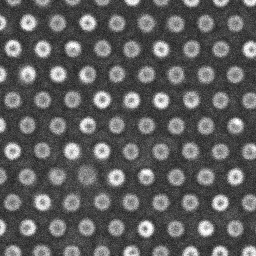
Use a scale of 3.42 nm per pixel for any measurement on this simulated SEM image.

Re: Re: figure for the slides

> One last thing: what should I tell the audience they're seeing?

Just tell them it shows a regular array of raised bodies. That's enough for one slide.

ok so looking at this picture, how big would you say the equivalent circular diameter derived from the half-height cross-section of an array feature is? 0.0519 um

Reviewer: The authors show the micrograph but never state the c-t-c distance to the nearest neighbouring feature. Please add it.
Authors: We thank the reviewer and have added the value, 0.0992 micrometres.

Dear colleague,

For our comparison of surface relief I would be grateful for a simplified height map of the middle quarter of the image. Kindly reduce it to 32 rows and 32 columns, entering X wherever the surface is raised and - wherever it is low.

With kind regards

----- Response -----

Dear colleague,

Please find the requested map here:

--------------------------------
-----XXX----XXX----XXX-----XX---
----XXXX---XXXX----XXX----XXXX--
----XXXX----XXX----XXX----XXXX--
-----XX--------------------XX---
--------------------------------
--------------------------------
-XX-----XXX-----XX-----XX------X
XXXX----XXX----XXXX---XXXX----XX
XXXX----XXX----XXXX---XXXX----XX
-XX------XX-----XX-----XXX-----X
--------------------------------
--------------------------------
------X-------------------------
----XXXX----XXX----XXX----XXXX--
----XXXX---XXXX----XXX----XXXX--
----XXXX----XX-----XXX----XXXX--
--------------------------------
--------------------------------
--------------------------------
-XX-----XXX-----XX-----XX-----XX
XXXX----XXX----XXX----XXXX----XX
XXXX----XXX----XXX----XXXX----XX
-XX------X------X------XX-------
--------------------------------
--------------------------------
--------------------------------
------------XXX----XXX----XXXX--
-----------XXXX----XXX----XXXX--
------------XXX----XXX----XXXX--
--------------------------------
--------------------------------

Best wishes